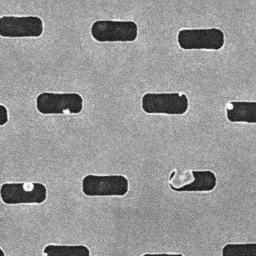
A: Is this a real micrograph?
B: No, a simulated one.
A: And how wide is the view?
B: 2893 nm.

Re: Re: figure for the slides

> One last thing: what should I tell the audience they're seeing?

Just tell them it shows holes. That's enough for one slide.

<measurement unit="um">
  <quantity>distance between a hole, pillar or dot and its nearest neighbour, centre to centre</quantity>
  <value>0.973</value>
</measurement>